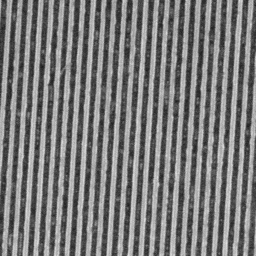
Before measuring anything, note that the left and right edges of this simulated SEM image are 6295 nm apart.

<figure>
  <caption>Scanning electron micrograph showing parallel lines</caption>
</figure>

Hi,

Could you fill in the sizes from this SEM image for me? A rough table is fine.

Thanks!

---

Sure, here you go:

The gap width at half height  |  153 nm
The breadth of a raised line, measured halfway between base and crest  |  0.089 microns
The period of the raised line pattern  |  0.258 µm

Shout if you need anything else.